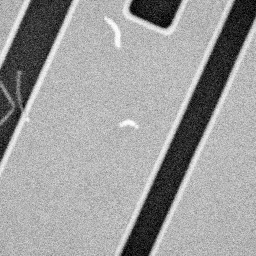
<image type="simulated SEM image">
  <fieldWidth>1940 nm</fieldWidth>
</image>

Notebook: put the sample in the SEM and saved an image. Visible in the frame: groups of lines, slits or small figures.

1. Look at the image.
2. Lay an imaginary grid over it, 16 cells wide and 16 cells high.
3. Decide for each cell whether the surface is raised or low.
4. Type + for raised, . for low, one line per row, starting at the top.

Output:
++..++++...+++..
+...+++++..+++..
+...+++++++++..+
...++++++++++..+
...++++++++++..+
..++++++++++..++
..++++++++++..++
.++++++++++..+++
.++++++++++..+++
++++++++++..++++
++++++++++..++++
+++++++++..+++++
+++++++++..+++++
++++++++...+++++
++++++++..++++++
++++++++..++++++